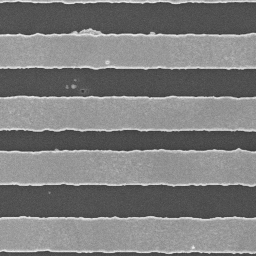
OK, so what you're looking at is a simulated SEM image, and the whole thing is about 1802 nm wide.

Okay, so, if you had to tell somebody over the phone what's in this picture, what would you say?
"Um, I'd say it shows lines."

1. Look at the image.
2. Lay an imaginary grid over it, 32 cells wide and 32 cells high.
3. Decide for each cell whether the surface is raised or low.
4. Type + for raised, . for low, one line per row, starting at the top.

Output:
................................
................................
................................
................................
++++++++++++++++++++++++++++++++
++++++++++++++++++++++++++++++++
++++++++++++++++++++++++++++++++
++++++++++++++++++++++++++++++++
++++.+++...++.++++++++++++++++++
................................
................................
................................
++++++++++++++++++++++++++++++++
++++++++++++++++++++++++++++++++
++++++++++++++++++++++++++++++++
++++++++++++++++++++++++++++++++
................................
................................
................................
++++++++++++++++++++++++++++++++
++++++++++++++++++++++++++++++++
++++++++++++++++++++++++++++++++
++++++++++++++++++++++++++++++++
................................
................................
................................
................................
++++++++++++++++++++++++++++++++
++++++++++++++++++++++++++++++++
++++++++++++++++++++++++++++++++
++++++++++++++++++++++++++++++++
.........+++.++..+++++++.+++++++